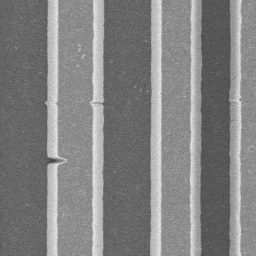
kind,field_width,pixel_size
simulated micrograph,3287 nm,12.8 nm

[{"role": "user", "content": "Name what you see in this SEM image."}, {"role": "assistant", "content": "one or a few lines or trenches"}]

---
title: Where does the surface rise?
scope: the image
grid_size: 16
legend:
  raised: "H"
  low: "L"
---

LLLHHHLLLLHHLLLH
LLLHHHLLLLHHLLLH
LLLHHHLLLLHHLLLH
LLLHHHLLLLHHLLLH
LLLHHHLLLLHHLLLH
LLLHHHLLLLHHLLLH
LLLHHHLLLLHHLLLH
LLLHHHLLLLHHLLLH
LLLHHHLLLLHHLLLH
LLLHHHLLLLHHLLLH
LLLHHHLLLLHHLLLH
LLLHHHLLLLHHLLLH
LLLHHHLLLLHHLLLH
LLLHHHLLLLHHLLLH
LLLHHHLLLLHHLLLH
LLLHHHLLLLHHLLLH